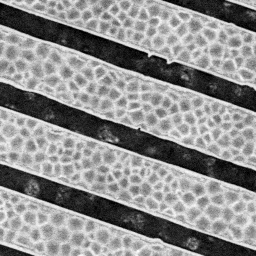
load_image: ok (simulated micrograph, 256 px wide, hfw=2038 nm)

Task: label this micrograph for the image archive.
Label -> one or a few lines or trenches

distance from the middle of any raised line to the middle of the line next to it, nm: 607